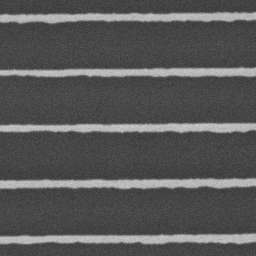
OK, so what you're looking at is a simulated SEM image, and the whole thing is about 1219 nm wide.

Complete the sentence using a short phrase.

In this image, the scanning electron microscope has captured lines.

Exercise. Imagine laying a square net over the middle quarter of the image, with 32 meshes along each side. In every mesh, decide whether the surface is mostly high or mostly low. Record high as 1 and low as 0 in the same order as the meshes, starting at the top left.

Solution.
00000000000000000000000000000000
11111111111111111111111111111111
11111111111111111111111111111111
00000000000000000000000000000000
00000000000000000000000000000000
00000000000000000000000000000000
00000000000000000000000000000000
00000000000000000000000000000000
00000000000000000000000000000000
00000000000000000000000000000000
00000000000000000000000000000000
00000000000000000000000000000000
00000000000000000000000000000000
00000000000000000000000000000000
00000000000000000000000000000000
11111111111111111111111111111111
11111111111111111111111111111111
00000000000000000000000000000000
00000000000000000000000000000000
00000000000000000000000000000000
00000000000000000000000000000000
00000000000000000000000000000000
00000000000000000000000000000000
00000000000000000000000000000000
00000000000000000000000000000000
00000000000000000000000000000000
00000000000000000000000000000000
00000000000000000000000000000000
00000000000000000000000000000000
11111111111111111111111111111111
11111111111111111111111111111111
00000000000000000000000000000000